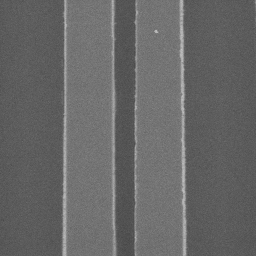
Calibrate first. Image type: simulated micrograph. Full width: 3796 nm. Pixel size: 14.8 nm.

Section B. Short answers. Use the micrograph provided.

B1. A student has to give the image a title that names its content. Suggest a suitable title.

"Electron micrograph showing lines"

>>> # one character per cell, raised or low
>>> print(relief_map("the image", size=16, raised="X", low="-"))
----XXXXXXX-----
----XXXXXXX-----
----XXXXXXX-----
----XXXXXXX-----
----XXXXXXX-----
----XXXXXXX-----
----XXXXXXX-----
----XXXXXXX-----
----XXXXXXX-----
----XXXXXXX-----
----XXXXXXX-----
----XXXXXXX-----
----XXXXXXX-----
----XXXXXXXX----
----XXXXXXXX----
----XXXXXXXX----